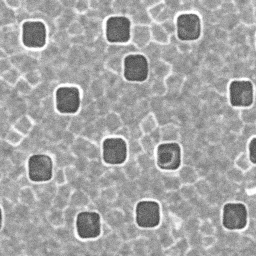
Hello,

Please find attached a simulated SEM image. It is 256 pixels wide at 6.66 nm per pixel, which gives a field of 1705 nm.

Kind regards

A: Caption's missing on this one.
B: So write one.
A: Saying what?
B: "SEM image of a regular array of holes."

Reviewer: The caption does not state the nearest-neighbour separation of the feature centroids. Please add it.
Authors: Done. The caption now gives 422 nm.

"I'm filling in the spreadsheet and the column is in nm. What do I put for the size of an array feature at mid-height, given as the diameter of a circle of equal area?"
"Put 189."